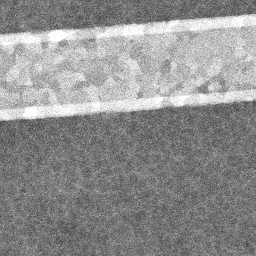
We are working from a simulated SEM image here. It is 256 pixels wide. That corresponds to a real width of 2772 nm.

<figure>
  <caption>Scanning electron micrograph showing one or a few lines or trenches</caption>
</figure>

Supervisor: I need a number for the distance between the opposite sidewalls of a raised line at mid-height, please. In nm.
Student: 793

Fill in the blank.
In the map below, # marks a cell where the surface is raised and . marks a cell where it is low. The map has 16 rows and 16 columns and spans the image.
................
.............###
################
################
################
################
########........
................
................
................
................
................
................
................
................
................